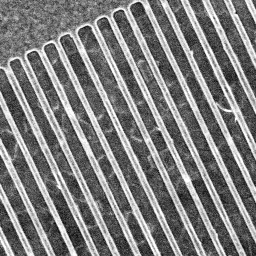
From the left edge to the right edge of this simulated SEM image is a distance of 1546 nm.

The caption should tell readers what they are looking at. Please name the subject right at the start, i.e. parallel lines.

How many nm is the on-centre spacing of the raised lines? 115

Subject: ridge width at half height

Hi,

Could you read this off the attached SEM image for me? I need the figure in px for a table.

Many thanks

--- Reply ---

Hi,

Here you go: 5.98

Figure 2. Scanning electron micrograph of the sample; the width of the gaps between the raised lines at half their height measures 76.3 nm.